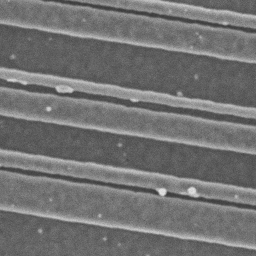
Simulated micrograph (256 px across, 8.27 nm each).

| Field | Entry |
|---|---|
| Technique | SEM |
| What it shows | lines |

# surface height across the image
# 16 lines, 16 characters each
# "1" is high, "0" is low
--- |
1111111111110000
1111111111111111
0000000111111111
0000000000000111
1000000000000000
1111111100000000
1111111111111100
0011111111111111
0000000001111111
0000000000000001
1111111000000000
1111111111111100
1111111111111111
0001111111111111
0000000001111111
0000000000000000